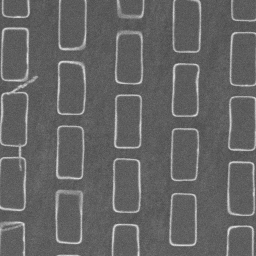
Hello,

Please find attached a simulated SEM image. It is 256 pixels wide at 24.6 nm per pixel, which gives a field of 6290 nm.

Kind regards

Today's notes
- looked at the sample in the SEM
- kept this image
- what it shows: groups of lines, slits or small figures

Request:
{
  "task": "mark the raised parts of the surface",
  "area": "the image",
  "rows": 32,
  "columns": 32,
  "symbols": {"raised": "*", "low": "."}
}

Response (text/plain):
****....***....***....***....***
****....***....***....***....***
.......****...........***.....**
.......****...........***.......
***....****....***....***....***
***....****....***....***....***
***............***....**.....***
***............***...........***
***....***....****....***....***
***....****...****....***....***
.......****...........***....***
.*.....****...........***.......
***....****...****....***....***
***....****...****....***....***
***...........****....**.....***
***...........****...........***
***....***....****....***....***
***....***....****....***....***
.......***...........****....***
.......***...........****.......
***....***....***....****....**.
***....***....***....****....***
***...........***.....**.....***
***...........****...........***
***....***....****....**.....***
***....***....***....****....***
.......***...........****....***
.......***...........****.......
***....***....***....****....**.
***....***....***....****...****
***...........***.....**....****
***...........***...........****